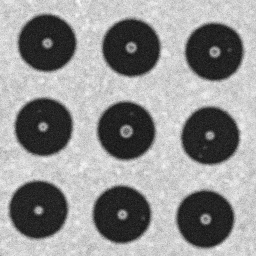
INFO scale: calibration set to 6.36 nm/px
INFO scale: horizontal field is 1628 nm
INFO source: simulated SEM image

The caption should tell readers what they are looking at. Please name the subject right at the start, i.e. an array of small figures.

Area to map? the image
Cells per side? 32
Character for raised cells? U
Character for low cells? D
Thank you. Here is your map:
UUUUUUUUUUUUUUUUUUUUUUUUUUUUUUUU
UUUUUUUUUUUUUUUUUUUUUUUUUUUUUUUU
UUUUDDDDUUUUUUUDDDUUUUUUUUUUUUUU
UUUDDDDDDUUUUUDDDDDUUUUUUDDDDUUU
UUDDDDDDDDUUUDDDDDDDUUUUDDDDDDUU
UUDDDUUDDDUUUDDDUDDDUUUDDDDDDDUU
UUDDDDDDDUUUUDDDUDDDUUUDDDUDDDDU
UUUDDDDDDUUUUDDDDDDDUUUDDDDDDDUU
UUUUDDDDUUUUUUDDDDDUUUUUDDDDDDUU
UUUUUUUUUUUUUUUDDDUUUUUUUDDDDUUU
UUUUUUUUUUUUUUUUUUUUUUUUUUUUUUUU
UUUUUUUUUUUUUUUUUUUUUUUUUUUUUUUU
UUUUDDDUUUUUUUUUUUUUUUUUUUUUUUUU
UUUDDDDDUUUUUDDDDDUUUUUUUDDDUUUU
UUDDDDDDDUUUUDDDDDDUUUUUDDDDDUUU
UUDDDUDDDUUUDDDDDDDUUUUDDDDDDDUU
UUDDDDDDDUUUDDDUUDDDUUUDDDDDDDUU
UUDDDDDDDUUUDDDDDDDUUUUDDDDDDDUU
UUUDDDDDUUUUUDDDDDDUUUUDDDDDDDUU
UUUUUDUUUUUUUUDDDDUUUUUDDDDDDUUU
UUUUUUUUUUUUUUUUUUUUUUUUUDDDUUUU
UUUUUUUUUUUUUUUUUUUUUUUUUUUUUUUU
UUUUUUUUUUUUUUUUUUUUUUUUUUUUUUUU
UUDDDDDUUUUUUUDDDUUUUUUUUUUUUUUU
UDDDDDDDUUUUDDDDDDUUUUUDDDDDUUUU
UDDDDDDDDUUUDDDDDDDUUUDDDDDDDUUU
UDDDUDDDDUUDDDDUDDDUUUDDDDDDDUUU
UDDDDDDDUUUUDDDDDDDUUUDDDUDDDUUU
UUDDDDDDUUUUDDDDDDDUUUDDDDDDDUUU
UUUDDDDUUUUUUDDDDDUUUUUDDDDDDUUU
UUUUUUUUUUUUUUUUUUUUUUUUDDDDUUUU
UUUUUUUUUUUUUUUUUUUUUUUUUUUUUUUU